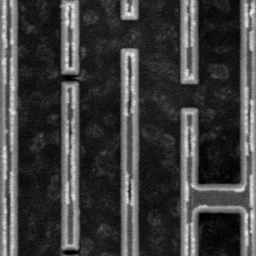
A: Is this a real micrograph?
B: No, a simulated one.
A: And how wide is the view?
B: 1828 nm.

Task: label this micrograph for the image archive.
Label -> parallel lines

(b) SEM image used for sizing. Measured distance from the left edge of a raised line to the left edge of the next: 430 nanometers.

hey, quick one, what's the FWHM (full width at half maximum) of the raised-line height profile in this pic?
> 0.0875 um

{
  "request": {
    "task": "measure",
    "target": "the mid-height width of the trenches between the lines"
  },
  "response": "346 nanometres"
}